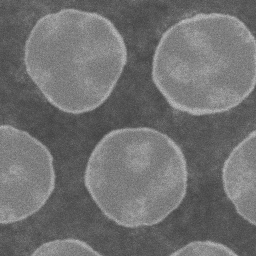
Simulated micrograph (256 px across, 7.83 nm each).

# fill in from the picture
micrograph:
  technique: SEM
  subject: raised bodies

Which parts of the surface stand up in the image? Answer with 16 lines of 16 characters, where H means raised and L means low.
LLLLLLLLLLLLLLLL
LLHHHHHLLLLHHHHL
LLHHHHHLLLHHHHHH
LLHHHHHHLLHHHHHH
LLHHHHHHLLHHHHHH
LLHHHHHLLLHHHHHH
LLLHHHLLLLLHHHHL
LLLLLLLLLLLLLLLL
HHLLLLLHHHLLLLLL
HHHLLLHHHHHLLLLH
HHHLLHHHHHHHLLHH
HHHLLHHHHHHHLLHH
HHHLLLHHHHHLLLHH
HHLLLLLHHHLLLLLH
LLLLLLLLLLLLLLLL
LLHHHHLLLLLHHHLL